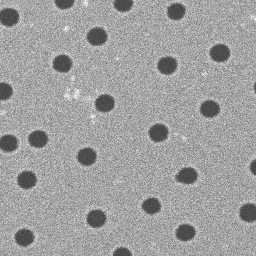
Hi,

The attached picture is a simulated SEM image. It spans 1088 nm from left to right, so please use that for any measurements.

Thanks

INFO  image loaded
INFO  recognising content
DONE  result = a regular array of holes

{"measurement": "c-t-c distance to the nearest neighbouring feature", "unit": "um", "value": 0.22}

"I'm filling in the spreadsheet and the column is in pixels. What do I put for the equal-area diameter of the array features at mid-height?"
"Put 19.6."